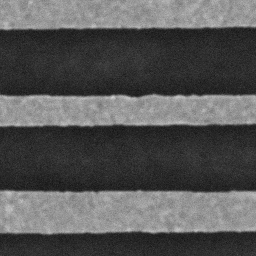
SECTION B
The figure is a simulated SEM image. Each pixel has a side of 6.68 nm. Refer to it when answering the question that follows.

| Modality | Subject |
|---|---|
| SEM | lines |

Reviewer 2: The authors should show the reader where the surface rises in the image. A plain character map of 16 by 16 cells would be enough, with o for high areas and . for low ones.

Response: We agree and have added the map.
oooooooooooooooo
oooooooooooooooo
................
................
................
................
oooooooooooooooo
oooooooooooooooo
................
................
................
................
oooooooooooooooo
oooooooooooooooo
ooooooo..o......
................